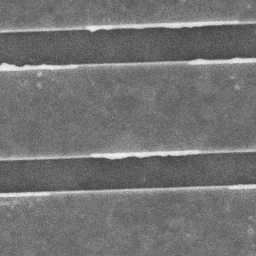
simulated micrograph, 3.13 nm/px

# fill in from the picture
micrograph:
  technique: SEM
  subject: one or a few lines or trenches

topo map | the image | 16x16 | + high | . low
++++++++++++++++
++++++++++++++..
................
................
++++++++++++++++
++++++++++++++++
++++++++++++++++
++++++++++++++++
++++++++++++++++
++++++++++++++..
................
................
++++++++++++++++
++++++++++++++++
++++++++++++++++
++++++++++++++++